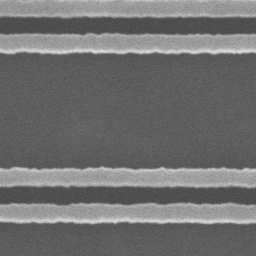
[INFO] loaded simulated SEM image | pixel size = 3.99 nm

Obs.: lines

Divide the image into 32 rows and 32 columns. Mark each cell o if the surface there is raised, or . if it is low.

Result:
oooooooooooooooooooooooooooooooo
oooooooooooooooooooooooooooooooo
................................
................................
oooooooooooooooooooooooooooooooo
oooooooooooooooooooooooooooooooo
oo...oooo...ooooooo.ooooo.ooooo.
................................
................................
................................
................................
................................
................................
................................
................................
................................
................................
................................
................................
................................
................................
oooooooooooooooooooooooooooooooo
oooooooooooooooooooooooooooooooo
................................
................................
..........o.o.....o...oo....o...
oooooooooooooooooooooooooooooooo
oooooooooooooooooooooooooooooooo
................................
................................
................................
................................